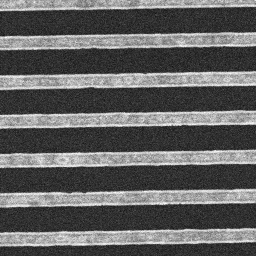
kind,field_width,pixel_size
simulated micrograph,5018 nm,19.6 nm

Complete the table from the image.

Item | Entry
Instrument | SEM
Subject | parallel lines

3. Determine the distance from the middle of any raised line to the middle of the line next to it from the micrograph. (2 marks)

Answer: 0.769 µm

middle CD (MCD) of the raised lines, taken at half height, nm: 235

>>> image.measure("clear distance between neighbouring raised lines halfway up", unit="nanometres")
527